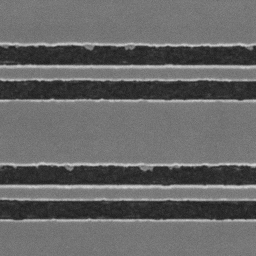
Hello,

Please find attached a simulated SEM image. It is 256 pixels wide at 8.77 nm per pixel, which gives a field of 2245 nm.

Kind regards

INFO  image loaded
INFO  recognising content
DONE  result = lines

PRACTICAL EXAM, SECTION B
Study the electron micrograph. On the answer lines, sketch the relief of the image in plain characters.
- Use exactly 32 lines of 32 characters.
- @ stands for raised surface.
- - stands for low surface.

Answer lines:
@@@@@@@@@@@@@@@@@@@@@@@@@@@@@@@@
@@@@@@@@@@@@@@@@@@@@@@@@@@@@@@@@
@@@@@@@@@@@@@@@@@@@@@@@@@@@@@@@@
@@@@@@@@@@@@@@@@@@@@@@@@@@@@@@@@
@@@@@@@@@@@@@@@@@@@@@@@@@@@@@@@@
@@@@@@@@@@@@@@@@@@@@@@@@@@@@@@@@
--------------------------------
--------------------------------
@@@@@@@@@@@@@@@@@@@@@@@@@@@@@@@@
@@@@@@@@@@@@@@@@@@@@@@@@@@@@@@@@
--------------------------------
--------------------------------
--@---@-----@-------------------
@@@@@@@@@@@@@@@@@@@@@@@@@@@@@@@@
@@@@@@@@@@@@@@@@@@@@@@@@@@@@@@@@
@@@@@@@@@@@@@@@@@@@@@@@@@@@@@@@@
@@@@@@@@@@@@@@@@@@@@@@@@@@@@@@@@
@@@@@@@@@@@@@@@@@@@@@@@@@@@@@@@@
@@@@@@@@@@@@@@@@@@@@@@@@@@@@@@@@
@@@@@@@@@@@@@@@@@@@@@@@@@@@@@@@@
@@@@@@@@@@@@@@@@@@@@@@@@@@@@@@@@
--------------------------------
--------------------------------
@@@@@@@@@@@@@@@@@@@@@@@@@@@@@@@@
@@@@@@@@@@@@@@@@@@@@@@@@@@@@@@@@
--------------------------------
--------------------------------
@@@@@@@@@@@@@@@@@@@@@@@@@@@-@@@@
@@@@@@@@@@@@@@@@@@@@@@@@@@@@@@@@
@@@@@@@@@@@@@@@@@@@@@@@@@@@@@@@@
@@@@@@@@@@@@@@@@@@@@@@@@@@@@@@@@
@@@@@@@@@@@@@@@@@@@@@@@@@@@@@@@@